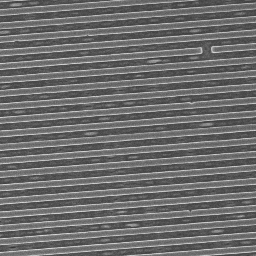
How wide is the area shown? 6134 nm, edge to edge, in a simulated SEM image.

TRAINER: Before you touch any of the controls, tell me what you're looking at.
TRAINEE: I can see parallel lines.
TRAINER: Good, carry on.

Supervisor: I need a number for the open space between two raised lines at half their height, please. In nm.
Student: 182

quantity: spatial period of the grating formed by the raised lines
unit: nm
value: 322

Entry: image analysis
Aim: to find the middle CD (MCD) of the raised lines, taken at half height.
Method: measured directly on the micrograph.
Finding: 143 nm